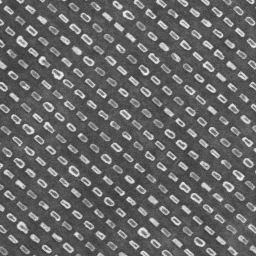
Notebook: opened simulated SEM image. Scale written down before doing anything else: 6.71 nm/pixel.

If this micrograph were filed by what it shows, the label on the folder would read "a regular array of raised bodies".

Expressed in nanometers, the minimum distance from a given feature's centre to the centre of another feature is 102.